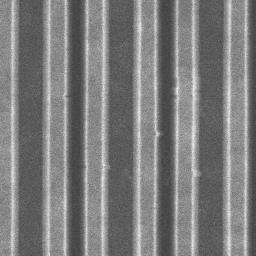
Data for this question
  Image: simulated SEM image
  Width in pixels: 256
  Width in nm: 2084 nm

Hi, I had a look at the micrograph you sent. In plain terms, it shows parallel lines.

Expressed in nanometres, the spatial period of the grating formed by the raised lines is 367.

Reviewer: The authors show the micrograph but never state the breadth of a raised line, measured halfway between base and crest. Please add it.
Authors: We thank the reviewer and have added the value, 182 nm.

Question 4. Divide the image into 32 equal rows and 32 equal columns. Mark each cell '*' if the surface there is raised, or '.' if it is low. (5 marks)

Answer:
**....***..**....***..**....***.
**....***..**....***..**....***.
**....***..**....***..**....***.
**....***..**....***..**....***.
**....***..**....***..**....***.
**....***..**....***..**....***.
**....***..**....***..**....***.
**....***..**....***..**....***.
**....***..**....***..**....***.
**....***..**....***..***...***.
**....***..**....***..***...***.
**....***..**....***..***...***.
**....**...**....***..***...***.
**....**..***....***..**....***.
**....**..***....***..***...***.
**....**..***....***..***...***.
**....**..***....***..**....***.
**....**..***....***..**....***.
**....**..***....***..**....***.
**....**..***....***..**....***.
**....**..***....***..**....***.
**....***.***....***..***...***.
**....**..***....***..**....***.
**....**..***....***..**....***.
**....**..***....***..**....***.
**....**..***....***..**....***.
**....**..***....***..**....***.
**....**..***....***..**....***.
**....**..***....***..**....***.
**....**...**....***..**....***.
**....**...**....***..**....***.
**....**...**....***..**....***.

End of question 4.